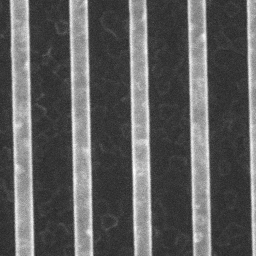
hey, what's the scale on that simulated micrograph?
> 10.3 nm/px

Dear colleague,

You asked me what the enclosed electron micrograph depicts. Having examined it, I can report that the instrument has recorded parallel lines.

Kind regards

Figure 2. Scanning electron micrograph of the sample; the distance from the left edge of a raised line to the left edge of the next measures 609 nanometres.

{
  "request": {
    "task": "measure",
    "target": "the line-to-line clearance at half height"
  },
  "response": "434 nanometres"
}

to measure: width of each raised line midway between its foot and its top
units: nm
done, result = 171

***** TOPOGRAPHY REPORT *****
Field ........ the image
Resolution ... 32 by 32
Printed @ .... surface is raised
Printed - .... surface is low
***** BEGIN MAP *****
-@@------@@-----@@------@@-----@
-@@------@@-----@@------@@-----@
-@@@-----@@-----@@------@@-----@
-@@@-----@@-----@@------@@-----@
-@@@-----@@-----@@------@@-----@
--@@-----@@-----@@------@@-----@
-@@@-----@@-----@@------@@-----@
-@@@-----@@-----@@------@@-----@
--@@-----@@-----@@------@@-----@
--@@-----@@-----@@------@@-----@
--@@-----@@-----@@------@@-----@
--@@-----@@-----@@------@@-----@
--@@-----@@------@------@@-----@
--@@-----@@------@------@@-----@
--@@-----@@------@@-----@@-----@
--@@-----@@------@@-----@@-----@
--@@-----@@------@@-----@@-----@
--@@-----@@------@@-----@@-----@
--@@-----@@--@---@@-----@@-----@
--@@-----@@------@@-----@@-----@
--@@-----@@------@@-----@@-----@
--@@-----@@------@@-----@@-----@
--@@-----@@------@@-----@@-----@
--@@-----@@------@@-----@@------
--@@-----@@------@@-----@@------
--@@-----@@------@@-----@@------
--@@-----@@------@@-----@@------
--@@-----@@------@@-----@@------
--@@-----@@------@@-----@@------
--@@-----@@@-----@@-----@@------
--@@-----@@@-----@@-----@@------
--@@-----@@@-----@@-----@@------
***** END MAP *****